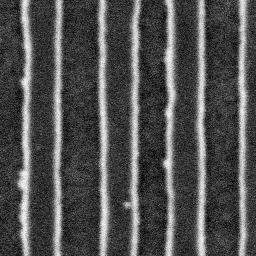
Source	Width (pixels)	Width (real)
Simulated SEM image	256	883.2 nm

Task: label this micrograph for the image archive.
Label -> lines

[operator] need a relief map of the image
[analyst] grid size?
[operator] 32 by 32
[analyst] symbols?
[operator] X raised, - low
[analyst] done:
---XXXXX-----XXXX----XXXX-----XX
---XXXXX-----XXXX----XXXX-----XX
---XXXXX-----XXXX----XXXX-----XX
---XXXX------XXXX----XXXX-----XX
---XXXX------XXXX----XXXX-----XX
---XXXX------XXXX----XXXX-----XX
---XXXX------XXXX----XXXX-----XX
---XXXX------XXXX----XXXX-----XX
---XXXX------XXXX----XXXX-----XX
---XXXX------XXXX----XXXX-----XX
---XXXX------XXXX----XXXX-----XX
---XXXX------XXXX----XXXX-----XX
---XXXX------XXXX----XXXX-----XX
---XXXX------XXXX----XXXX-----XX
---XXXX------XXXX----XXXX-----XX
---XXXX------XXXX----XXXX-----XX
---XXXX------XXXX----XXXX-----XX
---XXXX------XXXX----XXXX-----XX
---XXXX------XXXX----XXXX-----XX
---XXXX------XXXX----XXXX-----XX
---XXXX------XXXX----XXXX-----XX
---XXXX------XXXX----XXXX-----XX
---XXXX------XXXX----XXXX-----XX
---XXXX------XXXX----XXXX-----XX
---XXXX------XXXX----XXXX-----XX
---XXXX------XXXX----XXXX-----XX
---XXXX------XXXX----XXXX-----XX
---XXXX------XXXX----XXXX-----XX
---XXXX------XXXX----XXXX-----XX
---XXXX------XXXX----XXXX-----XX
---XXXX------XXXX----XXXX-----XX
---XXXX------XXXX----XXXX-----XX